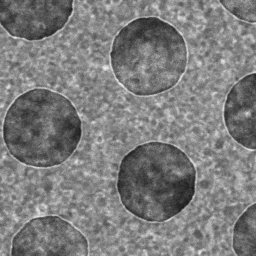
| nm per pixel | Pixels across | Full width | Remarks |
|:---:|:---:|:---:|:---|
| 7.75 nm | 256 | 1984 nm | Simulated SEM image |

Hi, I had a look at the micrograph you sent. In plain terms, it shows holes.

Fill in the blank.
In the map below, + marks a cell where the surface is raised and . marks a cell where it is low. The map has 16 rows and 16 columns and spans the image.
.....+++++++++..
....++++...+++++
+++++++....+++++
+++++++.....++++
+++++++....+++++
++++++++...++++.
+...++++++++++..
.....+++++++++..
.....+++++++++..
+....+++...+++++
+++++++.....++++
+++++++.....++++
++++++++....++++
+++++++++..++++.
+....++++++++++.
+.....+++++++++.